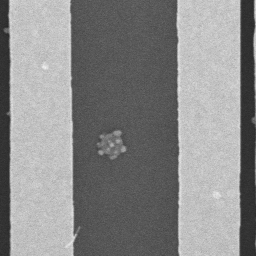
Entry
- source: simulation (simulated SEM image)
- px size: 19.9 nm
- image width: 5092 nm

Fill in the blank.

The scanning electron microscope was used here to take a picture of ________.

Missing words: lines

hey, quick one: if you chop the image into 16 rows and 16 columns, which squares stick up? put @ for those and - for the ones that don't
-@@@-------@@@@-
-@@@-------@@@@-
-@@@-------@@@@-
-@@@-------@@@@-
-@@@-------@@@@-
-@@@-------@@@@-
-@@@-------@@@@-
-@@@-------@@@@-
-@@@-------@@@@-
-@@@-------@@@@-
-@@@-------@@@@-
-@@@-------@@@@-
-@@@@------@@@@-
-@@@@------@@@@-
-@@@@------@@@@-
-@@@@------@@@@-